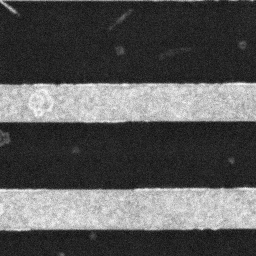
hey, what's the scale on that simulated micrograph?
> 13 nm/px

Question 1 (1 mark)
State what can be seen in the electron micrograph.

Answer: lines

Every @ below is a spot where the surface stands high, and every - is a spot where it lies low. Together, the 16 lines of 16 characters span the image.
----------------
----------------
----------------
----------------
----------------
@@@@@@@@@@@@@@@@
@@@@@@@@@@@@@@@@
@@@@@@@@@@@@@@@@
----------------
----------------
----------------
----------------
@@@@@@@@@@@@@@@@
@@@@@@@@@@@@@@@@
----------------
----------------